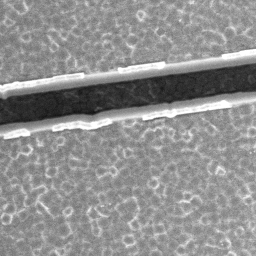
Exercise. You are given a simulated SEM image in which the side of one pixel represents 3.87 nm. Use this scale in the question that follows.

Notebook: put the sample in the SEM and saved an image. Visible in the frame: one or a few lines or trenches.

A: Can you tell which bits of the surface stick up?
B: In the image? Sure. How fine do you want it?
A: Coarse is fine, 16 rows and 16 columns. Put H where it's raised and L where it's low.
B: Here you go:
HHHHHHHHHHHHHHHH
HHHHHHHHHHHHHHHH
HHHHHHHHHHHHHHHH
HHHHHHHHHHHHHHHH
HHHHHHHHHHLLLLLL
HHLLLLLLLLLLLLLL
LLLLLLLLLLLLHHHH
LLLLLLHHHHHHHHHH
HHHHHHHHHHHHHHHH
HHHHHHHHHHHHHHHH
HHHHHHHHHHHHHHHH
HHHHHHHHHHHHHHHH
HHHHHHHHHHHHHHHH
HHHHHHHHHHHHHHHH
HHHHHHHHHHHHHHHH
HHHHHHHHHHHHHHHH